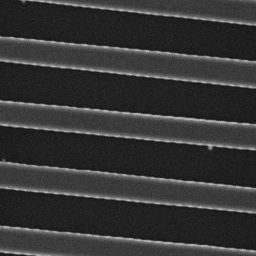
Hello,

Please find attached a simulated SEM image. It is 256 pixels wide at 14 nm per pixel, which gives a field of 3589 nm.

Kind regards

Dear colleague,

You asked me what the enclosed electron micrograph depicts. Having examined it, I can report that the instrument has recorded lines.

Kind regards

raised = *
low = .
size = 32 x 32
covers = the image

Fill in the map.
........************************
.................***************
..........................******
................................
................................
**********......................
********************............
******************************..
.........***********************
..................**************
...........................*****
................................
................................
**********......................
********************............
*******************************.
.........***********************
...................*************
.............................***
................................
***.............................
*************...................
**********************..........
********************************
..........**********************
....................************
...............................*
................................
***.............................
*************...................
***********************.........
********************************